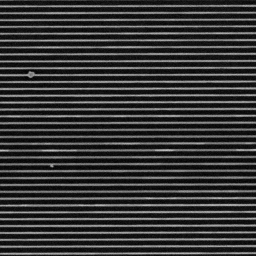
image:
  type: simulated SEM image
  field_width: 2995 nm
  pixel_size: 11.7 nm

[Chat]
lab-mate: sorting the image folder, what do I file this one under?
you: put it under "parallel lines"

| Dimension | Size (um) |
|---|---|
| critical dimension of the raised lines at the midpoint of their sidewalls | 0.0205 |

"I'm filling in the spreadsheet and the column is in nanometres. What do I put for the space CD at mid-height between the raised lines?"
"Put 60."